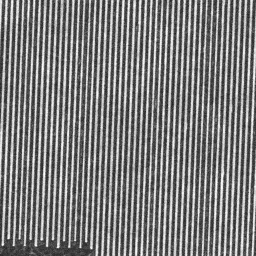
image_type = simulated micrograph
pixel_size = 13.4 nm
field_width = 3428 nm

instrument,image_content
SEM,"parallel lines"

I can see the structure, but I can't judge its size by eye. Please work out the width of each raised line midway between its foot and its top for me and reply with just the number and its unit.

25.1 nanometres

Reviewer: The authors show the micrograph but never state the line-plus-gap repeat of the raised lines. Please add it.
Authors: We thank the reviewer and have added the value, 74.4 nanometers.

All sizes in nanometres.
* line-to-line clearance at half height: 50.2